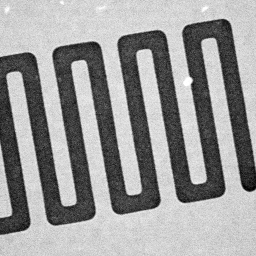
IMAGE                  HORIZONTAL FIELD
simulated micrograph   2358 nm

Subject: groups of lines, slits or small figures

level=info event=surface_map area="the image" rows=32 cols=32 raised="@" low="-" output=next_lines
@@@@@@@@@@@@@@@@@@@@@@@@@@@@@@@@
@@@@@@@@@@@@@@@@@@@@@@@@@@@@@@@@
@@@@@@@@@@@@@@@@@@@@@@@@@@--@@@@
@@@@@@@@@@@@@@@@@@@@@@@------@@@
@@@@@@@@@@@@@@@------@@------@@@
@@@@@@@@@---@@@------@@--@@--@@@
@@@@@@@------@@--@@--@@--@@--@@@
-----@@------@@--@@--@@---@---@@
-----@@--@@--@@--@@---@---@@--@@
-@@--@@--@@--@@--@@---@@--@@--@@
-@@--@@--@@---@---@@--@@--@@--@@
-@@--@@--@@---@@--@@--@@--@@--@@
-@@--@@---@@--@@--@@--@@--@@---@
-@@---@@--@@--@@--@@--@@---@---@
--@@--@@--@@--@@--@@---@---@@--@
--@@--@@--@@--@@--@@@--@@--@@--@
--@@--@@--@@---@---@@--@@--@@--@
--@@--@@--@@---@@--@@--@@--@@--@
--@@---@---@@--@@--@@--@@--@@---
---@---@@--@@--@@--@@--@@---@@--
---@@--@@--@@--@@--@@---@---@@--
@--@@--@@--@@--@@---@@--@@--@@--
@--@@--@@--@@---@---@@--@@--@@--
@--@@--@@--@@@--@@--@@------@@--
@--@@---@---@@------@@------@@@@
@---@---@---@@------@@@@@@@@@@@@
@---@@------@@---@@@@@@@@@@@@@@@
----@@-----@@@@@@@@@@@@@@@@@@@@@
----@@@@@@@@@@@@@@@@@@@@@@@@@@@@
@@@@@@@@@@@@@@@@@@@@@@@@@@@@@@@@
@@@@@@@@@@@@@@@@@@@@@@@@@@@@@@@@
@@@@@@@@@@@@@@@@@@@@@@@@@@@@@@@@